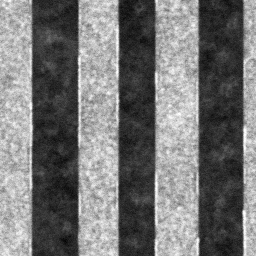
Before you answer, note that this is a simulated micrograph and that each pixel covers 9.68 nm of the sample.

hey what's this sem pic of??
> one or a few lines or trenches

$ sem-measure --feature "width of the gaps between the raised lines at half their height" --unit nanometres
444